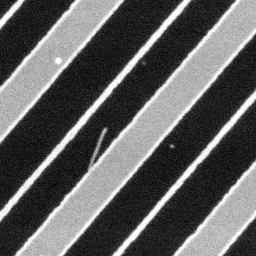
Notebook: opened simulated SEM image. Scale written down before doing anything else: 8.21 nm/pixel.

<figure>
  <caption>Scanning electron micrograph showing lines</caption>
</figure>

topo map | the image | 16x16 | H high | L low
LLLLHHHLLLLLLLHH
LLLLHHLLLLLLLLHH
LLLHHHLLLLLLLHHH
LLHHHLLLLLLLHHHL
LHHHLLLLLLLHHHLL
HHHLLLLLLLHHHLLL
HHLLLLLLLHHHLLLL
HLLLLLLLHHHLLLLL
LLLLLLLHHHLLLLLL
LLLLLLLHHHLLLLLL
LLLLLLHHHLLLLLLL
LLLLLHHHLLLLLLLH
LLLLHHHLLLLLLLHH
LLLHHHLLLLLLLHHH
LLHHHLLLLLLLHHHL
LHHHLLLLLLLHHHLL